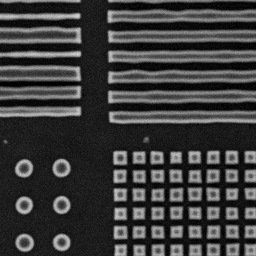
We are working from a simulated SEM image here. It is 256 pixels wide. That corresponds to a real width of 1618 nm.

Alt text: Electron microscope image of groups of lines, slits or small figures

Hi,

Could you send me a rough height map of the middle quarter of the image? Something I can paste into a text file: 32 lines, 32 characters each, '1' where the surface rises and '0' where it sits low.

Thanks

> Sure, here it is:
00000000000000000000000000000000
11110000000000000000000000000000
11110000000011111111111111111111
11110000000011111111111111111111
00000000000000000000000000000000
00000000000000000000000000000000
11110000000000000000000000000000
11110000000011111111111111111111
00000000000011111111111111111111
00000000000000000000000000000000
00000000000000000000000000000000
11110000000000000000000000000000
11110000000011111111111111111111
00000000000011111111111111111111
00000000000001110000000000000000
00000000000000000000000000000000
00000000000000000000000000000000
00000000000000000000000000000000
00000000000000000000000000000000
00000000000000000000000000000000
00000000000000000000000000000000
00000000000000000000000000000000
00000000000001100011001100011000
00000000000001100011001100011000
00000000000001100011001100000000
10000000000000000000000000000000
10000000000000000000000000000000
10000000000001100011001110011000
00000000000001100011001110011000
00000000000000000000000000000000
00000000000000000000000000000000
00000000000001100011000000011001